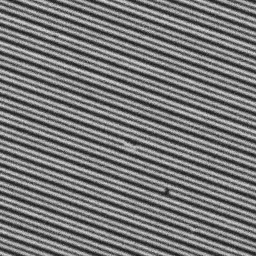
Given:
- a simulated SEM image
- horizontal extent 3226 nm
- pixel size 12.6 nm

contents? parallel lines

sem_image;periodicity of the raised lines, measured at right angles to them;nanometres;83.3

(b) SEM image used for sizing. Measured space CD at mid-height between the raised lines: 4.48 px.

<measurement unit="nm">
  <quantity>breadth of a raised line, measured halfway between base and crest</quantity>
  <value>34.2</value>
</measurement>